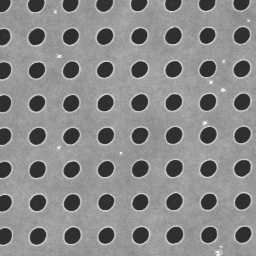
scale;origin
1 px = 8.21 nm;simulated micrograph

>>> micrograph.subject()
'a regular array of holes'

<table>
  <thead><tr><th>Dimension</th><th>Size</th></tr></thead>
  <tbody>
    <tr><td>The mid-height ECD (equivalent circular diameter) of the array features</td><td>132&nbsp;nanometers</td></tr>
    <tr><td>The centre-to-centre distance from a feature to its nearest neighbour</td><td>0.272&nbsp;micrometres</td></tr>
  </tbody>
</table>